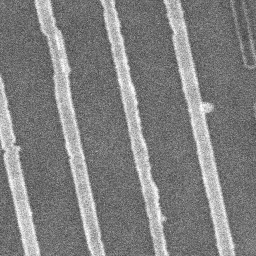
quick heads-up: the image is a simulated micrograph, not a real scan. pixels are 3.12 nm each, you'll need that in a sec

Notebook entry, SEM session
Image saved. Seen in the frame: one or a few lines or trenches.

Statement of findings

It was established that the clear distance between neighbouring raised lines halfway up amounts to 159 nanometers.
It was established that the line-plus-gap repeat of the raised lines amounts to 197 nm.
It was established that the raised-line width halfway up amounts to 39.6 nm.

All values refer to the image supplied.